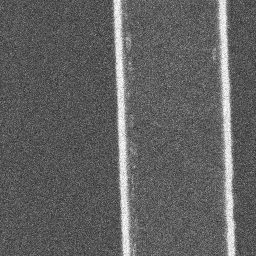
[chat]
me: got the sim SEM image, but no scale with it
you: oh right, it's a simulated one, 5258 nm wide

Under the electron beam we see one or a few lines or trenches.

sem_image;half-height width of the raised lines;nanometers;2150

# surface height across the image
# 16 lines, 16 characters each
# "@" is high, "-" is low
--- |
-------@@@@@@@--
-------@@@@@@@--
-------@@@@@@@--
-------@@@@@@@--
-------@@@@@@@--
--------@@@@@@--
--------@@@@@@--
--------@@@@@@--
--------@@@@@@--
--------@@@@@@--
--------@@@@@@--
--------@@@@@@--
--------@@@@@@--
--------@@@@@@--
--------@@@@@@--
--------@@@@@@--